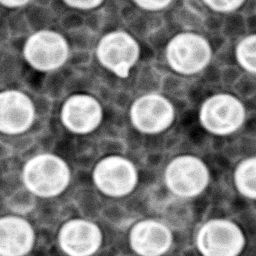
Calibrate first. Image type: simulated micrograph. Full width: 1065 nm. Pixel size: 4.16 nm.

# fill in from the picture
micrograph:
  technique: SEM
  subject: a regular array of raised bodies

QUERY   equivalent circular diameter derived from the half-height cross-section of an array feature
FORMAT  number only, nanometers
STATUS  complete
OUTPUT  169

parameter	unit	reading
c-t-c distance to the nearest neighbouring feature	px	69.8